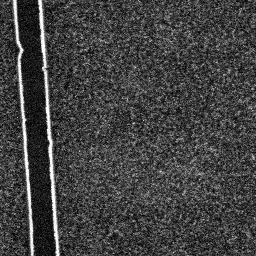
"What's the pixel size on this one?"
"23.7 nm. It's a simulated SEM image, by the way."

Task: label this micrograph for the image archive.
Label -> one or a few lines or trenches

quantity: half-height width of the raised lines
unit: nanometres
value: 585